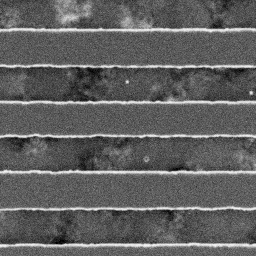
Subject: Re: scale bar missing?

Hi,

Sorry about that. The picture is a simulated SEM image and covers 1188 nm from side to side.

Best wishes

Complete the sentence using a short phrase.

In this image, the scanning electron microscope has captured lines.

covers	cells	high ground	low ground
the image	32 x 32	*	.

................................
................................
................................
................................
********************************
********************************
********************************
********************************
................................
................................
................................
................................
................................
********************************
********************************
********************************
********************************
................................
................................
................................
................................
************************.*******
********************************
********************************
********************************
********************************
................................
................................
................................
................................
........................*.......
********************************